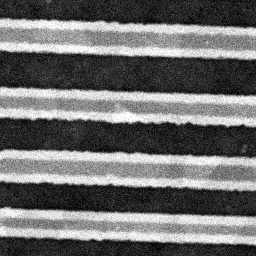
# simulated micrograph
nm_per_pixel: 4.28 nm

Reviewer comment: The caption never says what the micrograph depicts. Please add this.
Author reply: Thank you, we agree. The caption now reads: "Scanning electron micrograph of one or a few lines or trenches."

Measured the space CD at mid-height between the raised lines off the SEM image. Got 171 nm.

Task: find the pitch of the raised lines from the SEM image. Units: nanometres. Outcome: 267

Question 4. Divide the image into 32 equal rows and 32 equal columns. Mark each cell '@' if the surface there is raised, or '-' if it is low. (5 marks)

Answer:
--------------------------------
--------------------------------
--------------------------------
@@@@@@@@@@@@@@@@@-@-------------
@@@@@@@@@@@@@@@@@@@@@@@@@@@@@@@@
@@@@@@@@@@@@@@@@@@@@@@@@@@@@@@@@
--------------------@@@@@@@@@@@@
--------------------------------
--------------------------------
--------------------------------
--------------------------------
--------------------------------
@@@@@@@@@@@@@@@@@@@@@@@@@@@@@---
@@@@@@@@@@@@@@@@@@@@@@@@@@@@@@@@
----@-----@-@@@@@@@@@@@@@@@@@@@@
--------------------------------
--------------------------------
--------------------------------
--------------------------------
@@@@@@@@@@----------------------
@@@@@@@@@@@@@@@@@@@@@@@@@@@@@@@@
@@@@@@@@@@@@@@@@@@@@@@@@@@@@@@@@
----------@@@@@@@@@@@@@@@@@@@@@@
--------------------------------
--------------------------------
--------------------------------
--------------------------------
@@@@@@@@@@@@@@@@@@@@@@@@@-------
@@@@@@@@@@@@@@@@@@@@@@@@@@@@@@@@
---------------@-@@@@@@@@@@@@@@@
--------------------------------
--------------------------------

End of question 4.